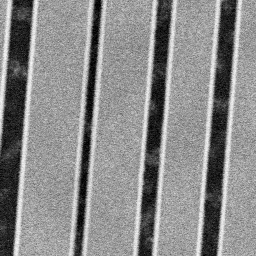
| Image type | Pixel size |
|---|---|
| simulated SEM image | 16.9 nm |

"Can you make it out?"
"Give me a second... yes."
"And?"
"one or a few lines or trenches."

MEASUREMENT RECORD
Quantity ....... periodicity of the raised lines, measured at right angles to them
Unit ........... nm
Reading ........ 1120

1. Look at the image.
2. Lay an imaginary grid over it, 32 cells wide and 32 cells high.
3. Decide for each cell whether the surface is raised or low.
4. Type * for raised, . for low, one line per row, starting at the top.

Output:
*....******..******...*****...**
*...*******..******...*****...**
*...*******..******...*****...**
*...*******..******...*****...**
*...*******..******...*****...**
*...*******..******...*****...**
*...*******..******..******...**
*...*******..******..******..***
....*******.*******..******..***
....*******.*******..*****...***
....******..******...*****...***
....******..******...*****...***
....******..******...*****...***
...*******..******...*****...***
...*******..******...*****...***
...*******..******...*****...***
...*******..******...*****...***
...*******..******...*****...***
...*******..******..******...***
...*******..******..******..****
...*******..******..******..****
...*******.*******..******..****
...*******.*******..*****...****
...******..******...*****...****
...******..******...*****...****
..*******..******...*****...****
..*******..******...*****...****
..*******..******...*****...****
..*******..******...*****...****
..*******..******...*****...****
..*******..******...*****...****
..*******..******..******...****